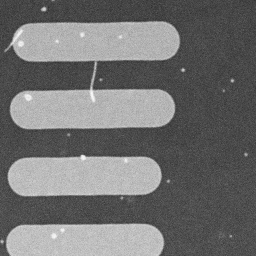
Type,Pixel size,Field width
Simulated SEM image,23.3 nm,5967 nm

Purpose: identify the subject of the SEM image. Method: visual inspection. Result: groups of lines, slits or small figures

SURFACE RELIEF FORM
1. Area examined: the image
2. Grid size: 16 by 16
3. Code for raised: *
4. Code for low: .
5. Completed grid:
................
......****......
.**********.....
.**********.....
................
................
.**********.....
.*********......
................
................
.*********......
.*********......
................
................
.*********......
**********......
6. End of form